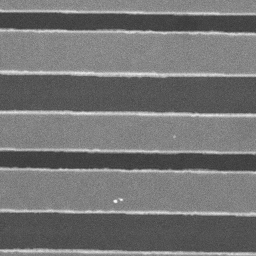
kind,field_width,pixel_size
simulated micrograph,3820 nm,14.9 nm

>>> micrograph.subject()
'lines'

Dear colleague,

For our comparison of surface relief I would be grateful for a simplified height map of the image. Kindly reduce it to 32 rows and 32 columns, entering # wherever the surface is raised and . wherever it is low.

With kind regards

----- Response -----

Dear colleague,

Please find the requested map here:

################################
.#.#############################
................................
................................
################################
################################
################################
################################
################################
................................
................................
................................
................................
................................
################################
################################
################################
################################
################################
................................
................................
############################....
################################
################################
################################
################################
...............#################
................................
................................
................................
................................
###############.................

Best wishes